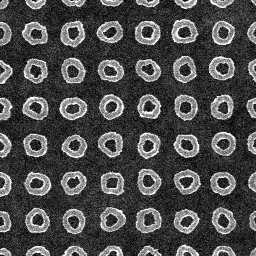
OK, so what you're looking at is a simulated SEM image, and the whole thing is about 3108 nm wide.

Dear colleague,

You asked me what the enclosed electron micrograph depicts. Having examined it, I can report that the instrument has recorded a regular array of ring-shaped raised bodies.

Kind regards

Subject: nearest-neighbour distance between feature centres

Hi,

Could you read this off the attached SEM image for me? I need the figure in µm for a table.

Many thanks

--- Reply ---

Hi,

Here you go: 0.437